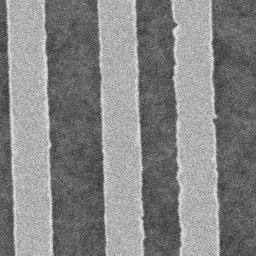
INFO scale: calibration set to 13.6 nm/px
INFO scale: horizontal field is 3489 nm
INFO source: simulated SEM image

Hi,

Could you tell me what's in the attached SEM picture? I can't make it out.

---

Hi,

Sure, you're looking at one or a few lines or trenches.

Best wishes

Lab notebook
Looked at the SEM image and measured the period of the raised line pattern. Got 1130 nm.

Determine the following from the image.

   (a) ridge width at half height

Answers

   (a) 501 nm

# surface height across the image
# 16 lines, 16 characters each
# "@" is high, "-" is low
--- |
@@@---@@---@@---
-@@---@@---@@---
-@@---@@@--@@---
-@@---@@@--@@---
-@@---@@@--@@---
-@@---@@@--@@---
-@@---@@@--@@---
-@@---@@@--@@---
-@@---@@@--@@---
-@@----@@--@@---
-@@----@@--@@---
-@@----@@--@@@--
-@@----@@--@@@--
-@@----@@--@@@--
-@@----@@--@@@--
-@@----@@--@@@--